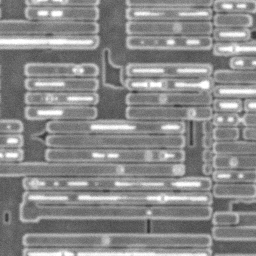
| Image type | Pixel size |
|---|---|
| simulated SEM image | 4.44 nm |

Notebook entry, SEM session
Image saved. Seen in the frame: wiring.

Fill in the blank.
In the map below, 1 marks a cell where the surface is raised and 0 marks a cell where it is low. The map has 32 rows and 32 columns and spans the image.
00011111111100001111111111111111
00011111111100001111111111111111
00011111111100001111111111111110
11111111111100001111111111111110
11111111111100001111111111111110
11111111111100001111111111111111
00000000000000000000000000011111
00000000000000000000000000000111
00011111111100001111111111000111
00011111111100001111111111111111
00011111111100001111111111111111
00011111111100001111111111111111
00011111111100001111111111111111
00011111111100001111111111111111
00011111111100001111111111111101
11100011111111111111111000111101
11100011111111111111111000011111
11100011111111111111111000011111
11100011111111111111111000011111
11100011111111111111111000011111
11111111111111111111111000011111
11111111111111111111111000111111
00011111111111111111111111111111
00011111111111111111111111111111
00011111111111111111111111111111
00011111111111111111111111000000
00011111111111111111111111100000
00011000000000000000000000011100
00000000000000000000000000011111
00011111111111111111111111111111
00011111111111111111111111000000
00011111111111111111111111000000